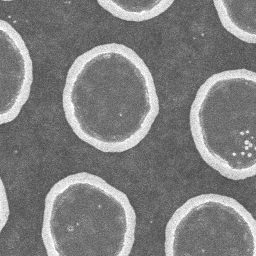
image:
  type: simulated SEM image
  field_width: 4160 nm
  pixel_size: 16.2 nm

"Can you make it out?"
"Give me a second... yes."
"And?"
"raised bodies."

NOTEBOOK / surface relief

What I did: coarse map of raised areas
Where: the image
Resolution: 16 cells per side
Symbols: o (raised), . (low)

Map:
.......ooo....oo
..............oo
o...............
oo....oo........
oo...oooo.......
oo..ooooo....ooo
o...oooooo..oooo
.....oooo...oooo
.....oooo...oooo
.............ooo
..............oo
....oo..........
...ooooo.....o..
...ooooo...oooo.
...ooooo...ooooo
...ooooo...ooooo